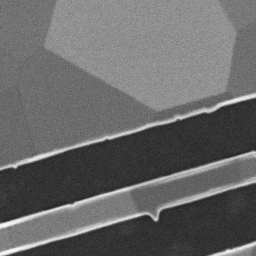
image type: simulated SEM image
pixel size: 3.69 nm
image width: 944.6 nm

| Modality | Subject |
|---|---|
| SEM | one or a few lines or trenches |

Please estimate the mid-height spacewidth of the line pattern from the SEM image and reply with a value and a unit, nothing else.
0.193 um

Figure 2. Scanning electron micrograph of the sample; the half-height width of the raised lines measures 109 nm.